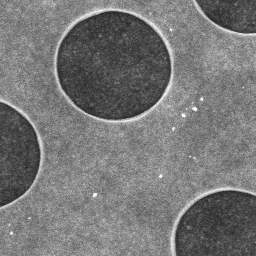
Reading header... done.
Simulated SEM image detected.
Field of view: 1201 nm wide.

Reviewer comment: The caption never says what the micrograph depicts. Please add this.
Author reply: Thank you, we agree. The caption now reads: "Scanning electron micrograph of holes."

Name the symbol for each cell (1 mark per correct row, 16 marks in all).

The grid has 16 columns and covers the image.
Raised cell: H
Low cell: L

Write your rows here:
HHHHHHHHHHHHLLLL
HHHHHLLLLHHHHLLL
HHHHLLLLLLHHHHHH
HHHHLLLLLLLHHHHH
HHHHLLLLLLLHHHHH
HHHHLLLLLLHHHHHH
HHHHHLLLLLHHHHHH
LLHHHHHLHHHHHHHH
LLHHHHHHHHHHHHHH
LLLHHHHHHHHHHHHH
LLHHHHHHHHHHHHHH
LLHHHHHHHHHHHHHH
LHHHHHHHHHHHLLLL
HHHHHHHHHHHLLLLL
HHHHHHHHHHHLLLLL
HHHHHHHHHHHLLLLL